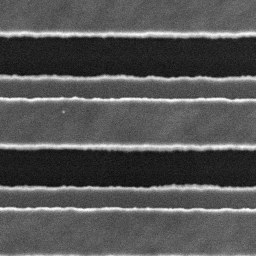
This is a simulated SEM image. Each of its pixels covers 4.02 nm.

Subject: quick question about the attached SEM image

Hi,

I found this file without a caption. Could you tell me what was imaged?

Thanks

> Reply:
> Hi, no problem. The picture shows lines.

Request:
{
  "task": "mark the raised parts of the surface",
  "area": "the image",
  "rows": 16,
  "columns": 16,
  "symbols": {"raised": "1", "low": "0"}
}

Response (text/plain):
1111111111111111
1111111111111111
0000000000000000
0000000000000000
0000000000000000
1111111111111111
1111111111111111
1111111111111111
1111111111111111
0000000000000000
0000000000000000
0000000000000000
1111111111111111
1111111111111111
1111111111111111
1111111111111111